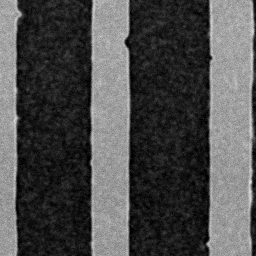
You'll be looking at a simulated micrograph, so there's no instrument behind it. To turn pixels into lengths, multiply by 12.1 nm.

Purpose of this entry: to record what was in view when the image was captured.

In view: one or a few lines or trenches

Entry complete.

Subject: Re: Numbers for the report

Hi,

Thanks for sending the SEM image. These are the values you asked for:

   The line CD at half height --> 464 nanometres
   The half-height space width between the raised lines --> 77.4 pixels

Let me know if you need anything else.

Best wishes